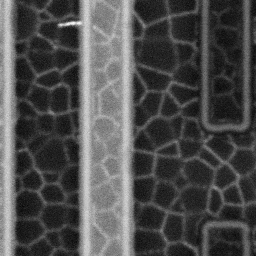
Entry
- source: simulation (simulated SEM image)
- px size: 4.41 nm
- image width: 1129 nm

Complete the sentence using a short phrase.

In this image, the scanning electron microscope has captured one or a few lines or trenches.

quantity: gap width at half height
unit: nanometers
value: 350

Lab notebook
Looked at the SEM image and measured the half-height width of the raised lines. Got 175 nm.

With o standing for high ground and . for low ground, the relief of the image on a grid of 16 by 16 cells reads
.....ooo.....oo.
.....ooo.....oo.
.....ooo.....oo.
.....ooo.....oo.
.....ooo.....oo.
.....ooo.....oo.
.....ooo.....oo.
o....ooo.....oo.
.....ooo........
.....ooo........
.....ooo........
.....ooo........
.....ooo........
.....ooo........
.....ooo.....oo.
.....ooo.....oo.